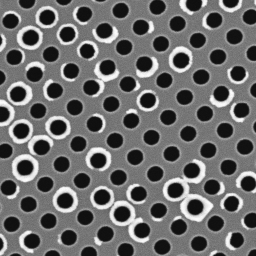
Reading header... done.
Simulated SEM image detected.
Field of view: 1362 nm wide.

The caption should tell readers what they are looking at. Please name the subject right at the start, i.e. a regular array of holes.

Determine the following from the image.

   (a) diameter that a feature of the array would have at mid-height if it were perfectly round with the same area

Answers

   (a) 84.9 nanometres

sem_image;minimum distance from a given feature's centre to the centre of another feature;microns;0.138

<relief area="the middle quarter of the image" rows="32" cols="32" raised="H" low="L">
LLLHHHHHHLLLLHHHHHLLLLHHHHHHLLLH
LLLLHHHHHLLLLHHHHHHLLHHHHHHHHHHH
LLLLHHHHHHLLHHHHHHHHHHHHLLHHHHHH
HLLHHHHHHHHHHHHLLHHHHHHLLLLHHHHH
HHHHHLLLHHHHHHLLLLHHHHHLLLLHHHHH
HHHHHLLLLHHHHHLLLLHHHHHHLLHHHHHH
HHHHHLLLLHHHHHLLLHHHHHHHHHHHHHLH
HHHHHHLLHHHHHHHHHHHHLLHHHHHHLLLL
HHHHHHHHHHLLLHHHHHHLLLLHHHHHLLLL
HLLLHHHHHHLLLLHHHHHLLLLHHHHHHLLL
HLLLLHHHHHLLLLHHHHHHLLHHHHHHHHHH
HLLLLHHHHHLLLHHHHHHHHHHHHLLHHHHH
HHLLHHHHHHHHHHHHLLHHHHHHLLLLHHHH
HHHHHHHLLHHHHHHLLLLHHHHHLLLLHHHH
HHHHHHLLLLHHHHHLLLLHHHHHLLLLHHHH
LHHHHHLLLLHHHHHLLLHHHHHHHHHHHHHH
LHHHHHLLLHHHHHHHHHHHHLLHHHHHHLLL
HHHHHHHHHHHHLLHHHHHHLLLLHHHHHLLL
HHLLLHHHHHHLLLLHHHHHLLLLHHHHHLLL
HHLLLLHHHHHLLLLHHHHHLLLLHHHHHHHH
HHLLLLHHHHHLLLHHHHHHHHHHHHHHHHHH
HHLLLHHHHHHHHHHHHLLHHHHHHLLLLHHH
HHHHHHHHLLHHHHHHLLLLHHHHHLLLLHHH
LHHHHHHLLLLHHHHHLLLLHHHHHLLLLHHH
LHHHHHHLLLLHHHHHLLLHHHHHHHHHHHHH
LHHHHHHLLLHHHHHHHHHHHHHHHHHHHHLL
LHHHHHHHHHHHHLHHHHHHHLLLLHHHHHLL
HHHHLHHHHHHHLLLLHHHHHLLLLHHHHHLL
HHHLLLLHHHHLLLLLHHHHHLLLHHHHHHHL
HHLLLLLHHHHHLLLHHHHHHHHHHHHHHHHH
HHHLLLHHHHHHHHHHHHHHHHHHHHLLLLHH
HHHHHHHHHLHHHHHHHLLLLHHHHHLLLLHH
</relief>